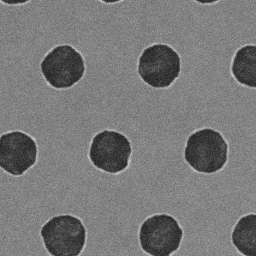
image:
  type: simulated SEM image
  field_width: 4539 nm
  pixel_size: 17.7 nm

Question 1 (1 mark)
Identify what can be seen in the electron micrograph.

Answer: holes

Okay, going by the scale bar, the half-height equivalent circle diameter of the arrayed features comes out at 759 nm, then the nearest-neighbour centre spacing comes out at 1700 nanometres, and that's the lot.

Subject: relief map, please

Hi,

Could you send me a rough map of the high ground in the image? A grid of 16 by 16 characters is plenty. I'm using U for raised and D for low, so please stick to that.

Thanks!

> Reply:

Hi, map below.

UUUUUUUUUUUUUUUU
UUUUUUUUUUUUUUUU
UUUUUUUUUUUUUUUU
UUUDDUUUUDDUUUUD
UUUDDUUUUDDUUUUD
UUUUUUUUUUUUUUUU
UUUUUUUUUUUUUUUU
UUUUUUUUUUUUUUUU
DDUUUUDDUUUUDDUU
DDUUUUDDUUUUDDUU
DDUUUUDDUUUUDDUU
UUUUUUUUUUUUUUUU
UUUUUUUUUUUUUUUU
UUUUUUUUUUDUUUUD
UUUDDUUUUDDUUUUD
UUUDDUUUUDDUUUUD